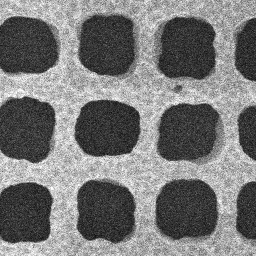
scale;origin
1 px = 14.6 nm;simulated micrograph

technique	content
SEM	holes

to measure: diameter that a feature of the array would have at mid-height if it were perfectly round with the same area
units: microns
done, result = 0.968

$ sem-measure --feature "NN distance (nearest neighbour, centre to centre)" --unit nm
1130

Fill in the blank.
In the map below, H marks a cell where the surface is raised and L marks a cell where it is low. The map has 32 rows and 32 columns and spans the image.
HHHHHHHHHHHHHHHHHHHHHHHHHHHHHHHH
HHHHHHHHHHHHHHHHHHHHHHHHHHHHHHHH
HLLLLHHHHHLLLLLLLHHHHLLLLLHHHHHL
LLLLLLLHHHLLLLLLLHHHLLLLLLLHHHLL
LLLLLLLHHHLLLLLLLHHLLLLLLLLHHLLL
LLLLLLLLHHLLLLLLLHHLLLLLLLLHHLLL
LLLLLLLLHHLLLLLLLHHLLLLLLLLHHLLL
LLLLLLLHHHLLLLLLLHHLLLLLLLLHHLLL
LLLLLLHHHHHLLLLLLHHHLLLLLLLHHHLL
HHHHHHHHHHHHHHLLHHHHLLLLLLHHHHLL
HHHHHHHHHHHHHHHHHHHHHHHHHHHHHHHH
HHHHHHHHHHHHHHHHHHHHHHHHHHHHHHHH
HLLLLHHHHHHHLLHHHHHHHHHHHHHHHHHH
LLLLLLLHHHLLLLLLLHHHHLLLLLLHHHHL
LLLLLLLHHHLLLLLLLHHHLLLLLLLLHHLL
LLLLLLLHHLLLLLLLLHHHLLLLLLLLHHLL
LLLLLLLHHLLLLLLLLLHHLLLLLLLLHHLL
LLLLLLLHHLLLLLLLLHHHLLLLLLLLHHLL
LLLLLLLHHHLLLLLLLHHHLLLLLLLLHHLL
HLLLLLHHHHHHLHHHHHHHLLLLLLLHHHHL
HHHHHHHHHHHHHHHHHHHHHHHHLHHHHHHH
HHHHHHHHHHHHHHHHHHHHHHHHHHHHHHHH
HHHHHHHHHHHHLLHHHHHHHLLLLHHHHHHH
HLLLLLHHHHLLLLLLHHHHLLLLLLHHHHLL
LLLLLLHHHHLLLLLLLHHHLLLLLLLHHHLL
LLLLLLLHHHLLLLLLLHHLLLLLLLLHHHLL
LLLLLLHHHHLLLLLLLHHLLLLLLLLHHHLL
LLLLLLHHHHLLLLLLLHHLLLLLLLLHHHLL
LLLLLLHHHHLLLLLLLHHHLLLLLLLHHHLL
LLLLLLHHHHLLLLLLLHHHLLLLLLHHHHLL
HHHHHHHHHHHHHHHHHHHHHHHHHHHHHHHH
HHHHHHHHHHHHHHHHHHHHHHHHHHHHHHHH